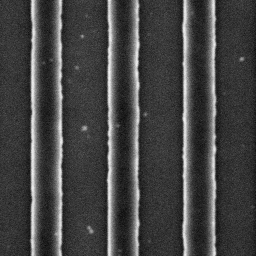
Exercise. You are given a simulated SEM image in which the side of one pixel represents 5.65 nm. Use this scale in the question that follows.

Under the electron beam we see lines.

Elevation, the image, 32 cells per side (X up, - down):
----XXXX------XXX------XXXX-----
----XXXX------XXX------XXXX-----
----XXXX------XXX------XXXX-----
----XXXX------XXX------XXXX-----
----XXX-------XXX------XXXX-----
----XXXX------XXX------XXXX-----
----XXXX------XXX------XXXX-----
----XXXX------XXX------XXXX-----
----XXXX------XXX------XXXX-----
----XXXX------XXX------XXXX-----
----XXXX------XXX------XXXX-----
----XXXX------XXX------XXXX-----
----XXXX------XXX------XXXX-----
----XXXX------XXX------XXXX-----
----XXXX------XXX------XXXX-----
----XXXX------XXX------XXXX-----
----XXXX------XXX------XXXX-----
----XXXX------XXX------XXXX-----
----XXXX------XXX------XXXX-----
----XXXX------XXX------XXXX-----
----XXXX------XXX------XXXX-----
----XXXX------XXX------XXXX-----
----XXXX------XXX------XXXX-----
----XXXX------XXX------XXXX-----
----XXXX------XXX------XXXX-----
----XXXX------XXX------XXXX-----
----XXXX------XXX------XXXX-----
----XXXX------XXX------XXXX-----
----XXXX------XXX------XXXX-----
----XXXX------XXX------XXXX-----
----XXXX------XXX------XXXX-----
----XXXX------XXX------XXXX-----